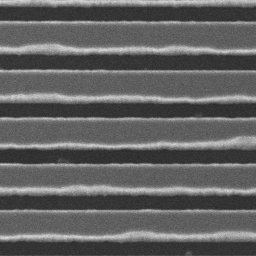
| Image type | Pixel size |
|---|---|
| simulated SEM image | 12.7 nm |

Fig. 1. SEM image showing lines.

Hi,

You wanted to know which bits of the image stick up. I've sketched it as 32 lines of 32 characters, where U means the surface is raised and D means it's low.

UUUUUUUUUUUUUUUUUUUUUUUUUUUUUUUU
DDDDDDDDDDDDDDDDDDDDDDDDDDDDDDDD
DDDDDDDDDDDDDDDDDDDDDDDDDDDDDDDD
UUUUUUUUUUUUUUUUUUUUUUUUUUUUUUUU
UUUUUUUUUUUUUUUUUUUUUUUUUUUUUUUU
UUUUUUUUUUUUUUUUUUUUUUUUUUUUUUUU
UUUUDDDUUUUUUUUUUUUUUUUUUUUUUUUU
DDDDDDDDDDDDDDDDDDDDDDDDDDDDDDDD
DDDDDDDDDDDDDDDDDDDDDDDDDDDDDDDD
UUUUUUUUUUUUUUUUUUUUUUUUUUUUUUUU
UUUUUUUUUUUUUUUUUUUUUUUUUUUUUUUU
UUUUUUUUUUUUUUUUUUUUUUUUUUUUUUUU
UUUUUDDUUUUUUUUUUUUUUUUUUUUUUUUU
DDDDDDDDDDDDDDDDDDDDDDDDDDDDDDDD
DDDDDDDDDDDDDDDDDDDDDDDDDDDDDDDD
UUUUUUUUUUUUUUUUUUUUUUUUUUUUUUUU
UUUUUUUUUUUUUUUUUUUUUUUUUUUUUUUU
UUUUUUUUUUUUUUUUUUUUUUUUUUUUUUUU
DDDDDDDDDDDDDUUDUUUDDDDDDDDDDDDD
DDDDDDDDDDDDDDDDDDDDDDDDDDDDDDDD
UUUDDUUUUUUDDUUUUUUDDDDDUUUUUUDU
UUUUUUUUUUUUUUUUUUUUUUUUUUUUUUUU
UUUUUUUUUUUUUUUUUUUUUUUUUUUUUUUU
UUUUUUUUUUUUUUUUUUUUUUUUUUUUUUUU
DDDDDDDDDDDDDDDDDDDDDDDDDDDDDDDD
DDDDDDDDDDDDDDDDDDDDDDDDDDDDDDDD
UUUUUUUUUUUUUUUUUUUUUUUUUUUUUUUU
UUUUUUUUUUUUUUUUUUUUUUUUUUUUUUUU
UUUUUUUUUUUUUUUUUUUUUUUUUUUUUUUU
UUUUUUUUUUUUUUUUUUUUUUUUUUUUUUUU
DDDDDDDDDDDDDDDDDDDDDDDDDDDDDDDD
DDDDDDDDDDDDDDDDDDDDDDDDDDDDDDDD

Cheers